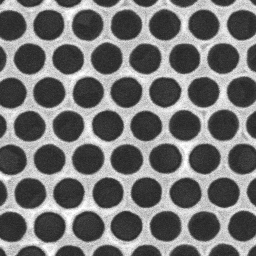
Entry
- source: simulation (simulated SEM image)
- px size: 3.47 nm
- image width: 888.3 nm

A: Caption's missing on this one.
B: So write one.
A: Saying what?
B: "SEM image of a regular array of holes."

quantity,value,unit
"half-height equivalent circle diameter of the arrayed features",109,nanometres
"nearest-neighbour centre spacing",0.133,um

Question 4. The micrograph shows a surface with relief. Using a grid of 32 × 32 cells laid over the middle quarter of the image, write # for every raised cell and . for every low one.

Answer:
.....##.......###.......###.....
....####.....#####.....#####....
..#######...########.########.##
####....######...#######...#####
###......####......###......####
###.......##.......##........##.
##........##........#........##.
.#........##........#........##.
##........##.......##........##.
###......####......###......####
####....######...#######...#####
################################
....####......####.....####.....
.....##.......###.......###.....
.....##........##.......##......
.....##........#.........#......
.....##........##.......##......
....####......###.......###.....
....#####....#####.....#####....
#.#########.########.###########
####....######....#####.....####
###......###.......###.......###
##........##.......###.......##.
##........##........#.........#.
##........##........#.........#.
##........##.......###.......##.
###......####......###......####
#####..########..###############
..########..########..########..
....####......####......####....
.....##........##.......###.....
.....##........##.......##......